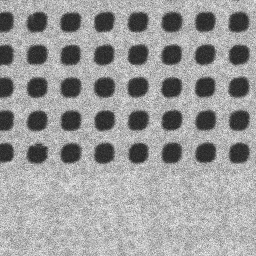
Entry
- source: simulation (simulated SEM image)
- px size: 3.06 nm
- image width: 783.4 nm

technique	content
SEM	a regular array of holes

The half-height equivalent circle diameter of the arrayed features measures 64.5 nm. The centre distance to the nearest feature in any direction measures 100 nm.